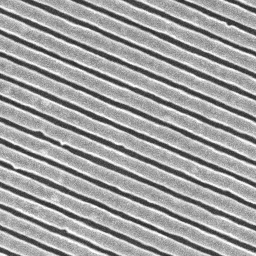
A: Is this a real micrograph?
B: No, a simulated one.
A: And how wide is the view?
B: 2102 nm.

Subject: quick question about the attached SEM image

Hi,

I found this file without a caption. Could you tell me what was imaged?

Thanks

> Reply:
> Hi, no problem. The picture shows parallel lines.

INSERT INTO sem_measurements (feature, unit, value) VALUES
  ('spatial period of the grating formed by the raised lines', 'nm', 164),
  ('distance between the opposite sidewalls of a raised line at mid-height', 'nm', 116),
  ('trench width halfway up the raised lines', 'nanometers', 46.2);